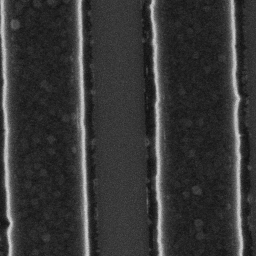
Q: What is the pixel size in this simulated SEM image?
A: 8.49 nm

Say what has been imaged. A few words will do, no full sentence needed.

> one or a few lines or trenches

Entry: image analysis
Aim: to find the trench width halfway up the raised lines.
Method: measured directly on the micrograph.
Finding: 0.621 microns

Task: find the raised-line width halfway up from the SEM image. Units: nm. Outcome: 668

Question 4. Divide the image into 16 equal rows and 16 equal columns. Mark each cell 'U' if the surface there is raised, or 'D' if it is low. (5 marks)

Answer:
UUUUUDDDDDUUUUUD
UUUUUDDDDDUUUUUD
UUUUUDDDDDUUUUUD
UUUUUDDDDDUUUUUD
UUUUUDDDDDUUUUUD
UUUUUDDDDDUUUUUD
UUUUUDDDDDUUUUUD
UUUUUDDDDDUUUUUD
UUUUUDDDDDUUUUUD
UUUUUDDDDDUUUUUD
UUUUUDDDDDUUUUUD
UUUUUDDDDDUUUUUD
DUUUUDDDDDUUUUUD
DUUUUDDDDDUUUUUD
DUUUUDDDDDUUUUUD
DUUUUDDDDDUUUUUD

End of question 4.